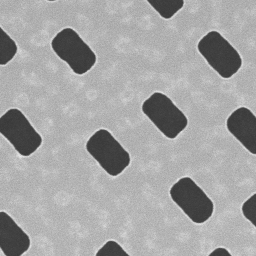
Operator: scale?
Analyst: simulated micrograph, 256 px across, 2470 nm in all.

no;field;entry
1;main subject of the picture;holes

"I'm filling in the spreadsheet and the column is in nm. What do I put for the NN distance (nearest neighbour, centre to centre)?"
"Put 791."